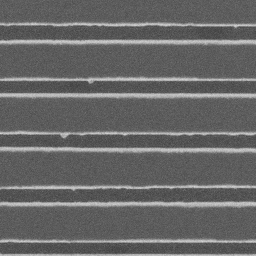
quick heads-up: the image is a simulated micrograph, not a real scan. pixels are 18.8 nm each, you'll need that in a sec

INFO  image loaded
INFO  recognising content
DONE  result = lines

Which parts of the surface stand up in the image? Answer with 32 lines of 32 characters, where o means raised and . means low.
oooooooooooooooooooooooooooooooo
oooooooooooooooooooooooooooooooo
oooooooooooooooooooooooooooooooo
................................
................................
oooooooooooooooooooooooooooooooo
oooooooooooooooooooooooooooooooo
oooooooooooooooooooooooooooooooo
oooooooooooooooooooooooooooooooo
oooooooooooooooooooooooooooooooo
................................
................................
oooooooooooooooooooooooooooooooo
oooooooooooooooooooooooooooooooo
oooooooooooooooooooooooooooooooo
oooooooooooooooooooooooooooooooo
oooooooooooooooooooooooooooooooo
................................
................................
oooooooooooooooooooooooooooooooo
oooooooooooooooooooooooooooooooo
oooooooooooooooooooooooooooooooo
oooooooooooooooooooooooooooooooo
oooo............oo..............
................................
................................
oooooooooooooooooooooooooooooooo
oooooooooooooooooooooooooooooooo
oooooooooooooooooooooooooooooooo
oooooooooooooooooooooooooooooooo
................................
................................